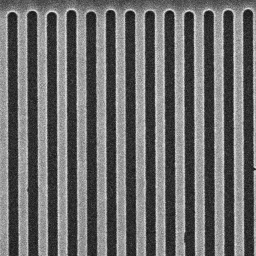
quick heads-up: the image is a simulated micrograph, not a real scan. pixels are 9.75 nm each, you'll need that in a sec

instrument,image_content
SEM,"parallel lines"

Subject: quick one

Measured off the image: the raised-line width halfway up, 89 nm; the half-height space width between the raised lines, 11 pixels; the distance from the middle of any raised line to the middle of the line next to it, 191 nm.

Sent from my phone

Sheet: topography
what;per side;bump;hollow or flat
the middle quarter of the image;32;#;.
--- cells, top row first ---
#..##...##...##...##...##...##..
...##...##...##...##...##...##..
...##...##...##...##...##...##..
...##...##...##...##...##...##..
...##...##...##...##...##...##..
...##...##...##...##...##...##..
...##...##...##...##...##...##..
...##...##...##...##...##...##..
...##...##...##...##...##...##..
...##...##...##...##...##...##..
...##...##...##...##...##...##..
...##...##...##...##...##...##..
#..##...##...##...##...##...##..
#..##...##...##...##...##...##..
...##...##...##...##...##...##..
...##...##...##...##...##...##..
...##...##...##...##...##...##..
...##...##...##...##...##...##..
...##...##...##...##...##...##..
...##...##...##...##...##...##..
...##...##...##...##...##...##..
...##...##...##...##...##...##..
...##...##...##...##...##...##..
#..##...##...##...##...##...##..
#..###..##...##...##...##...##..
...###..##...##...##...##...##..
#..###...#...##...##...##...##..
...###...#...##...##...##...##..
...###...#...##...##...##...##..
...###...#...##...##...##...##..
#..###...#...##...##...##...##..
#..###...#...##...##...##...##..